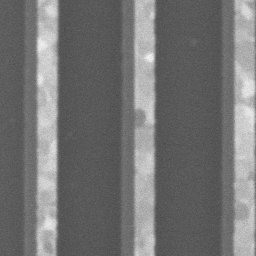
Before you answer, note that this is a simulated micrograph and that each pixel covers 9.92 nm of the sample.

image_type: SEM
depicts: lines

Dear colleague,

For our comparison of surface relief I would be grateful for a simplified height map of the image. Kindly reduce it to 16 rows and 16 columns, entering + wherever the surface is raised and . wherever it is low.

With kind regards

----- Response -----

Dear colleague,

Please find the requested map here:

..++....++....++
..++....++....++
..++....++....++
..++....++....++
..++....++....++
..++....++....++
..++....++....++
..++....++....++
..++....++....++
..++....++....++
..++....++....++
..++....++....++
..++....++....++
..++....++....++
..++....++....++
..+.....++....++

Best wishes